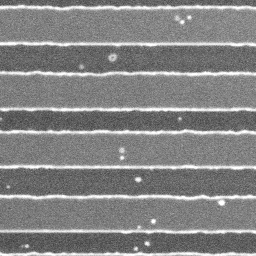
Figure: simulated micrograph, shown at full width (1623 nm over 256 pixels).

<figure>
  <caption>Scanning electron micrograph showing lines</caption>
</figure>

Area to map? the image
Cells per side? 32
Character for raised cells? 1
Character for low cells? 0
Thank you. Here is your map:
00000000000000000000000000000000
11111111111111111111111111111111
11111111111111111111111111111111
11111111111111111111111111111111
11111111111111111111111111111111
11011111111111111111111111111111
00000000000000000000000000000000
00000000000000000000000000000000
00000000000000000000000000000000
11111111111111111111111111111111
11111111111111111111111111111111
11111111111111111111111111111111
11111111111111111111111111111111
11111111111111111111111111111111
00000000000000000000000000000000
00000000000000000000000000000000
11111010100111010000101110000010
11111111111111111111111111111111
11111111111111111111111111111111
11111111111111111111111111111111
11111111111111111111111111111111
00000000000000000000000000000000
00000000000000000000000000000000
00000000000000000000000000000000
00000000000000000000000000000000
11111111111111111111111111111111
11111111111111111111111111111111
11111111111111111111111111111111
11111111111111111111111111111111
00000000000000000000000000000000
00000000000000000000000000000000
00000000000000000000000000000000